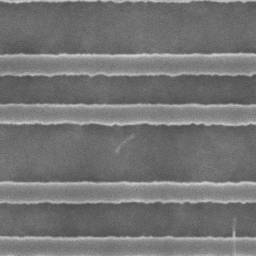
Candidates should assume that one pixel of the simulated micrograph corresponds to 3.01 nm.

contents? lines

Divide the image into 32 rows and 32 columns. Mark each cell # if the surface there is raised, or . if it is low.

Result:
................................
................................
................................
................................
................................
................................
................................
################################
################################
..#...#..............#..........
................................
................................
................................
################################
################################
..#..##..##.#####..############.
................................
................................
................................
................................
................................
................................
................................
################################
################################
................................
................................
................................
................................
................................
################################
################################